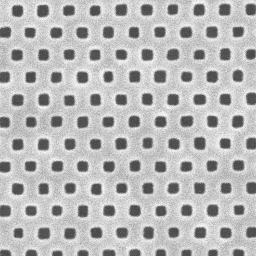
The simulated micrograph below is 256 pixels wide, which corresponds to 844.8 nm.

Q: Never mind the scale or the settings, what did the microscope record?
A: a regular array of holes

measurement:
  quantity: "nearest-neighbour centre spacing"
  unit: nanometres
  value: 83.7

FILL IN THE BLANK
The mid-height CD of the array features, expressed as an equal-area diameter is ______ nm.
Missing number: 41.9